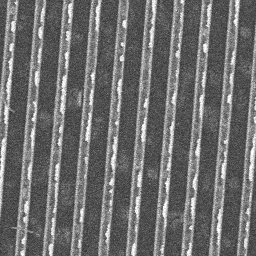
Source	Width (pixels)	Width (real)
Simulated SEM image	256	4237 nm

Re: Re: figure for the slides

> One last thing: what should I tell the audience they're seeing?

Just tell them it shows parallel lines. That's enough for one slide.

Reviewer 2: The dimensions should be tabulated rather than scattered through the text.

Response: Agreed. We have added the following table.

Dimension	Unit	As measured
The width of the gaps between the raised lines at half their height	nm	295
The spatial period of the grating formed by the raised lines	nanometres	457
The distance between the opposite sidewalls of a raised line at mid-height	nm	163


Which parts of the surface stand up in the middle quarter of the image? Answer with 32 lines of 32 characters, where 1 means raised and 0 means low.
10000011000001100001110000111000
10000011000001100001110000111000
10000011000001100001110000110000
10000011000011100001100000110000
10000111000011000001100000110000
00000110000011000001100000110000
00000110000011000001100000110000
00000110000011000001100000110000
00000110000011000001100000110000
00000110000011000001100000110000
00000110000011000001100000110000
00000110000011000001100001110000
00000110000011000011100001100000
00000110000011000011000001110000
00000110000011000011000001110000
00000110000011000011000001100000
00001110000110000011000001100000
00001100000110000011000001100000
00001100000110000011000001100000
00001100000110000011000001100000
00001100000110000011000001100000
00001100000110000011000001100000
00001100000110000011000001100000
00001100000110000011000011100001
00001100000110000111000011100001
00001100000110000110000011100001
00011100000110000110000011100001
00011100000110000110000011000001
00011100001100000110000011000001
00011000001100000110000011000001
00011000001100000110000011000001
00011000001100000110000011000001